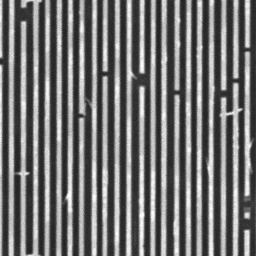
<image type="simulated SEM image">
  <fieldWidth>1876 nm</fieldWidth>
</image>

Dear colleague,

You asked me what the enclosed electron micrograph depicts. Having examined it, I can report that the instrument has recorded parallel lines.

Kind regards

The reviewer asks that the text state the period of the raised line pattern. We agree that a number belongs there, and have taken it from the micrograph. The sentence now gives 11.8 px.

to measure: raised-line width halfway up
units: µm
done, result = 0.0403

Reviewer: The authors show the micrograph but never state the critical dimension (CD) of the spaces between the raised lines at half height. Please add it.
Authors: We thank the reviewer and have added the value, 0.0477 microns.